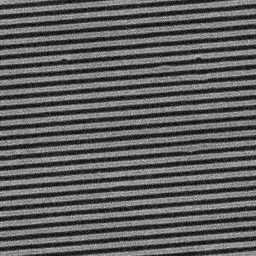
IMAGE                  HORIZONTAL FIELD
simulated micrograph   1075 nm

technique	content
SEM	parallel lines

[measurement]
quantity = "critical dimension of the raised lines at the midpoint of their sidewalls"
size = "18.3 nanometres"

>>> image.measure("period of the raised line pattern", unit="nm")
42.2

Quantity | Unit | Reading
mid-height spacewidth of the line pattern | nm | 21.9